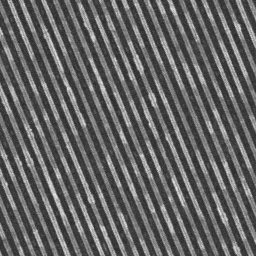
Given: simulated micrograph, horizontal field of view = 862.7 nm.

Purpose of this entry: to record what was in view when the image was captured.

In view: parallel lines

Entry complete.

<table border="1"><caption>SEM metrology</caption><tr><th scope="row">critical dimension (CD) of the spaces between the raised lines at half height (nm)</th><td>22.6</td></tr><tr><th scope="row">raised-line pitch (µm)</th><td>0.0357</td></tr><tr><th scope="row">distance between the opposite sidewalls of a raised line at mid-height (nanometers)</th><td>12.8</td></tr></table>